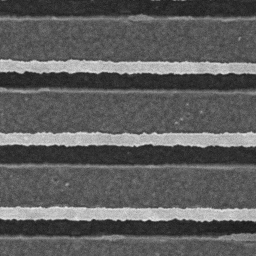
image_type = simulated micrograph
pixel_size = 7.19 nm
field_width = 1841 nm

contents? lines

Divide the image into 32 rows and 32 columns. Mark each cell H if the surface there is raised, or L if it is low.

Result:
LLLLLLLLLLLLLLLLLLLLLLLLLLLLLLLL
LLLLLLLLLLLLLLLLLLLLLLLLLLLLLLLL
HHHHHHHHHHHHHHHHHHHHHHHHHHHHHHHH
HHHHHHHHHHHHHHHHHHHHHHHHHHHHHHHH
HHHHHHHHHHHHHHHHHHHHHHHHHHHHHHHH
HHHHHHHHHHHHHHHHHHHHHHHHHHHHHHHH
HHHHHHHHHHHHHHHHHHHHHHHHHHHHHHHH
HHHHHHHHHHHHHHHHHHHHHHHHHHHHHHHH
HHHHHHHHHHHHHHHHHHHHHHHHHHHHHHHH
LLLLLLLLLLLLLLLLLLLLLLLLLLLLLLLL
LLLLLLLLLLLLLLLLLLLLLLLLLLLLLLLL
HHHHHHHHHHHHHHHHHHHHHHHHLLHLLLLL
HHHHHHHHHHHHHHHHHHHHHHHHHHHHHHHH
HHHHHHHHHHHHHHHHHHHHHHHHHHHHHHHH
HHHHHHHHHHHHHHHHHHHHHHHHHHHHHHHH
HHHHHHHHHHHHHHHHHHHHHHHHHHHHHHHH
HHHHHHHHHHHHHHHHHHHHHHHHHHHHHHHH
HHHHHHHHHHHHHHHHHHHHHHHHHHHHHHHH
LLLLLLLLLLLLLLLLLLLLLLLLLLLLLLLL
LLLLLLLLLLLLLLLLLLLLLLLLLLLLLLLL
LLLLLLLLLLLLLLLLLLLLLLLLLLLLLLLL
HHHHHHHHHHHHHHHHHHHHHHHHHHHHHHHH
HHHHHHHHHHHHHHHHHHHHHHHHHHHHHHHH
HHHHHHHHHHHHHHHHHHHHHHHHHHHHHHHH
HHHHHHHHHHHHHHHHHHHHHHHHHHHHHHHH
HHHHHHHHHHHHHHHHHHHHHHHHHHHHHHHH
HHHHHHHHHHHHHHHHHHHHHHHHHHHHHHHH
LLLLLLLLLHHLLLLLLHHHHLLLHHHHLHHH
LLLLLLLLLLLLLLLLLLLLLLLLLLLLLLLL
LLLLLLLLLLLLLLHLLLLLLLLLLLLLHHHH
HHHHHHHHHHHHHHHHHHHHHHHHHHHHHHHH
HHHHHHHHHHHHHHHHHHHHHHHHHHHHHHHH